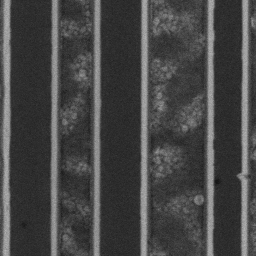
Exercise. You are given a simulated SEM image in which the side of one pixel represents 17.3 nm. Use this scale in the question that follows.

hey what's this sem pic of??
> one or a few lines or trenches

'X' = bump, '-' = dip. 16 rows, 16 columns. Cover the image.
XXX---XXX----XX-
XXX---XXX----XX-
XXX---XXX----XX-
XXX---XXX----XX-
XXX---XXX----XX-
XXX---XXX----XX-
XXX---XXX----XX-
XXX---XXX----XX-
XXX---XXX----XX-
XXX---XXX----XX-
XXX---XXX----XX-
XXX---XXX----XX-
XXX---XXX----XX-
XXX---XXX----XX-
XXX---XXX----XX-
XXX---XXX----XX-